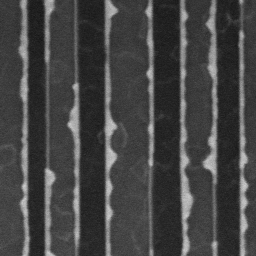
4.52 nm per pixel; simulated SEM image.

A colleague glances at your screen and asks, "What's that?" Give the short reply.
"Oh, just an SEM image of one or a few lines or trenches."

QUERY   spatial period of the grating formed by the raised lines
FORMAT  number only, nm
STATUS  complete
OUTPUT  289